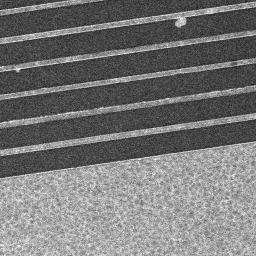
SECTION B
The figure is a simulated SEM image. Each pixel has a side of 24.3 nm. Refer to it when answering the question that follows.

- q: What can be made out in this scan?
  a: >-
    parallel lines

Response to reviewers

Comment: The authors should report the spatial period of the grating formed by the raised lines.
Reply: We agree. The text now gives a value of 671 nm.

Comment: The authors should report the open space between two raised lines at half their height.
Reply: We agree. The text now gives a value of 549 nm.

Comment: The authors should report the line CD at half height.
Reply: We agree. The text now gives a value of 0.123 µm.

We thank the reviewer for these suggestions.